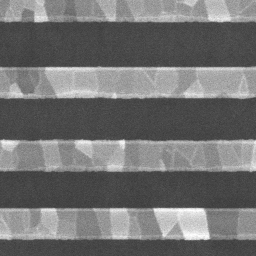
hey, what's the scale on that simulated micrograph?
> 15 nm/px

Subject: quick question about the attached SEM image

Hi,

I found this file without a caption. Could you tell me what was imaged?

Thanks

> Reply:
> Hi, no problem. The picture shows lines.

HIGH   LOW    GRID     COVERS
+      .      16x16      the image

++++++++++++++++
................
................
................
++++++++++++++++
++++++++++++++++
................
................
................
++++++++++++++++
++++++++++++++++
................
................
++++++++++++++++
++++++++++++++++
................